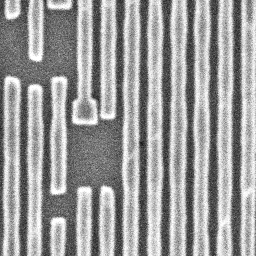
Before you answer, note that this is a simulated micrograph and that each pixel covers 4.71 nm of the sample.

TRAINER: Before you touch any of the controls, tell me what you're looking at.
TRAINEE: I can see wiring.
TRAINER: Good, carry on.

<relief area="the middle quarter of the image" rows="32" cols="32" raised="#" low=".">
....###...###..###...###...###..
....###...###..###...###...###..
....###...###..###...###...###..
....###...###..###...###...###..
....###...###..###...###...###..
....###...###..###...###...###..
....###...###..###...###...###..
....###...###..###...###...###..
...####...###..###...###...###..
...#####..###..###...###...###..
...#####..###..###...###...###..
...#####..###..###...###...###..
..######.####..###...###...###..
..######.......###...###...###..
...#####.......###...###...###..
...............###...###...###..
...............###...###...###..
...............###...###...###..
...............###...###...###..
...............###...###...###..
...............###...###...###..
...............###...###...###..
...............###...###...###..
...............###...###...###..
...............###...###...###..
...............###...###...###..
...............###...###...###..
...............###...###...###..
...............###...###...###..
...............###...###...###..
...............###...###...###..
....###...##...###...###...###..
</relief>